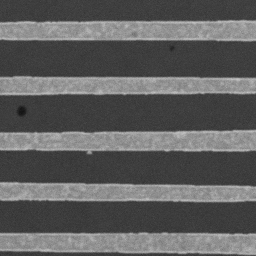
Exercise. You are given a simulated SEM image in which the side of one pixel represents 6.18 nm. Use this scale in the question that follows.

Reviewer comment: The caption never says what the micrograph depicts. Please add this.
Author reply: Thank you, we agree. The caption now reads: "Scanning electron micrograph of lines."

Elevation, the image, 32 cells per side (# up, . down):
................................
................................
................................
################################
################################
................................
................................
................................
................................
................................
################################
################################
................................
................................
................................
................................
......................##########
################################
################################
................................
................................
................................
................................
################################
################################
................................
................................
................................
................................
################################
################################
...............#################